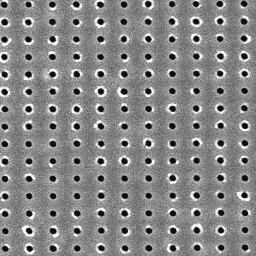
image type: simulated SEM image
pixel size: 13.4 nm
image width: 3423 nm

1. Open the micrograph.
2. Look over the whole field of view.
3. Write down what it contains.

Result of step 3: a regular array of holes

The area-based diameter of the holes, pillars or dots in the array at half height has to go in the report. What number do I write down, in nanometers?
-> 90.5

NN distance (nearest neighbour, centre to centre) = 230 nm